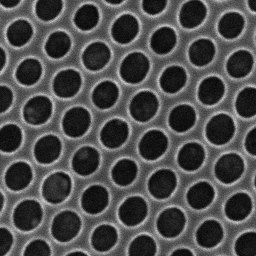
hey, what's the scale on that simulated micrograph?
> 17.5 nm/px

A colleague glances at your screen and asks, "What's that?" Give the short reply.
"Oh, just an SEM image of a regular array of holes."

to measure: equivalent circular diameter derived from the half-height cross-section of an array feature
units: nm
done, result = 514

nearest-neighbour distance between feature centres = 692 nm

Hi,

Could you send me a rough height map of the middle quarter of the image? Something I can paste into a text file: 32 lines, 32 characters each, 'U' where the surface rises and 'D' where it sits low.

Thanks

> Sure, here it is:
UUUUUDDDDDUUUUDDDDDDDDUUUUDDDUUU
DDDUUUDDDUUUUUDDDDDDDUUUUDDDDDUU
DDDDUUUUUUUUUUDDDDDDDUUUDDDDDDDU
DDDDUUUUUUUUUUDDDDDDUUUUDDDDDDDU
DDDDUUUUUDDDUUUDDDDUUUUUDDDDDDDU
DDDDUUUUDDDDDUUUUUUUUUUUDDDDDDUU
DDDDUUUDDDDDDDUUUUUUUUUUUDDDDUUU
DDDUUUUDDDDDDDUUUUDDDDDUUUUDUUUU
DDUUUUUDDDDDDDUUUDDDDDDUUUUUUUUU
UUUUUUUDDDDDDUUUUDDDDDDDUUUUUUUU
UUUUUUUUDDDDUUUUDDDDDDDDUUUUDDDD
UDDDDDUUUUUUUUUUDDDDDDDDUUUDDDDD
DDDDDDDUUUUUUUUUDDDDDDDUUUDDDDDD
DDDDDDDUUUUUUUUUUDDDDDUUUUDDDDDD
DDDDDDDUUUUDDDDDUUUDDUUUUUDDDDDD
DDDDDDUUUUDDDDDDUUUUUUUUUUDDDDDD
DDDDDDUUUDDDDDDDUUUUUDDDUUUDDDDU
DDDDDUUUUDDDDDDDUUUUDDDDDUUUUUUU
UUDUUUUUUDDDDDDDUUUDDDDDDDUUUUUU
UUUUUUUUUDDDDDDUUUUDDDDDDDUUUUUD
UUUUUDDUUUDDDDUUUUDDDDDDDDUUUUDD
UUUDDDDDUUUUUUUUUUUDDDDDDDUUUDDD
UUUDDDDDDUUUUUUUUUUDDDDDDUUUDDDD
UUDDDDDDDUUUUUUUUUUUDDDDUUUUDDDD
UUDDDDDDDUUUUDDDDDUUUUUUUUUUDDDD
UUDDDDDDDUUUDDDDDDUUUUUUUUUUUDDD
UUDDDDDDUUUUDDDDDDDUUUUDDDDUUUDD
DUUDDDDUUUUUDDDDDDUUUUDDDDDDUUUU
DDUUUUUUUUUUDDDDDDUUUDDDDDDDUUUU
DDUUUUUUUUUUDDDDDUUUUDDDDDDDUUUU
DDUUUUUDDDUUUUDDUUUUUDDDDDDDUUUU
DDUUUDDDDDDUUUUUUUUUUDDDDDDDUUUD